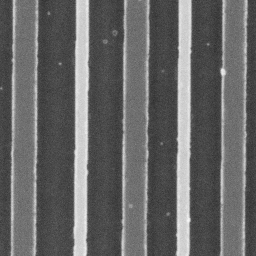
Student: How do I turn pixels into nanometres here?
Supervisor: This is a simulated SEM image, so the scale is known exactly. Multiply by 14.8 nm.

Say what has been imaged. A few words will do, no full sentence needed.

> lines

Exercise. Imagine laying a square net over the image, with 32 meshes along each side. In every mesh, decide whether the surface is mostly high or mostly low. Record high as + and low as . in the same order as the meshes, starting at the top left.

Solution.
..+++.....+.....+++...++....+++.
..+++.....+.....+++...++....+++.
..+++.....+.....+++...++....+++.
..+++.....+.....+++...++....+++.
..+++.....+.....+++...++....+++.
..+++.....+.....+++...++....+++.
..+++.....+.....+++...++....+++.
..+++.....+.....++....++....+++.
..+++.....+.....++....++....+++.
..+++....++.....++....++....+++.
..+++....++.....++....++....+++.
..+++....++.....++....++....+++.
..+++....++.....++....++....+++.
..+++....++.....++....++....+++.
..+++....++.....++....++....+++.
..+++....++.....++....++....+++.
..+++....++.....++....++....+++.
..+++....++....+++....++....+++.
.++++....++....+++....++....+++.
.++++....++....+++....++....+++.
..+++....++....+++....++....+++.
.+++.....++....+++....++....+++.
.+++.....++....+++....++....+++.
.+++.....++....+++....++....+++.
.+++.....++....+++....++....+++.
.+++.....++....+++....++....+++.
.+++.....++....+++....++....+++.
.+++.....++....+++....++....+++.
.+++.....++....+++....++....+++.
.+++.....++....+++....++....+++.
.+++.....++....+++....++....+++.
.+++.....++....+++....++....+++.